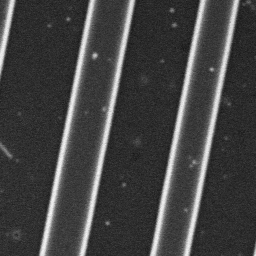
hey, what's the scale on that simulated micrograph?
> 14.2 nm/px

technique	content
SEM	groups of lines, slits or small figures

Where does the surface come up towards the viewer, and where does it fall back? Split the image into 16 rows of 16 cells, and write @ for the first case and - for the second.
@-----@@-----@@-
@----@@@----@@@-
-----@@@----@@--
-----@@@----@@--
-----@@-----@@--
-----@@-----@@--
----@@@----@@@--
----@@@----@@---
----@@@----@@---
----@@-----@@---
----@@-----@@---
---@@@----@@@---
---@@@----@@----
---@@@----@@----
---@@-----@@----
---@@-----@@----